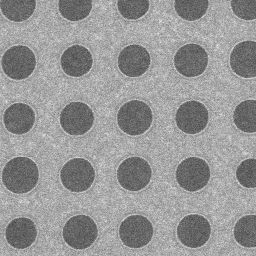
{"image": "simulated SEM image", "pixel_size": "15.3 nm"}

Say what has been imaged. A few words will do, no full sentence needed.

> a regular array of holes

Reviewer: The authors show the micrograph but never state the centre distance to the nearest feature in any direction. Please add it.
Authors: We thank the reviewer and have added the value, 864 nm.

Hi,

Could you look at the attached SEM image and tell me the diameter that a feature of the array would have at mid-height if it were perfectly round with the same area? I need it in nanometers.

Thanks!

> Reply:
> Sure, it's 527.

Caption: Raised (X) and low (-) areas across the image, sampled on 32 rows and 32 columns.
-----XX-----XXX----XXX----XXX---
----XXXX---XXXX---XXXX----XXX---
X--XXXXXX-XXXXXX-XXXXXX--XXXXXXX
XXXXXXXXXXXXXXXXXXXXXXXXXXXXXXXX
XXXXXXXXXXXXXXXXXXXXXXXXXXXXXXXX
XXXXXXXXXXXXXXXXXXXXXXXXXXXXXX--
X---XXXX---XXXX---XXXX----XXX---
----XXXX----XXX----XXX----XXX---
----XXXX---XXXX----XXX----XXX---
X---XXXXX-XXXXXX-XXXXXX-XXXXXX--
XXXXXXXXXXXXXXXXXXXXXXXXXXXXXXXX
XXXXXXXXXXXXXXXXXXXXXXXXXXXXXXXX
XXXXXXXXXXXXXXXXXXXXXXXXXXXXXXXX
X---XXXX---XXXX----XXX----XXX---
----XXXX----XXX----XXX----XXX---
----XXXX----XXX----XXX----XXX---
X--XXXXX---XXXX---XXXXX--XXXXXX-
XXXXXXXXXXXXXXXXXXXXXXXXXXXXXXXX
XXXXXXXXXXXXXXXXXXXXXXXXXXXXXXXX
XXXXXXXXXXXXXXXXXXXXXXXXXXXXXXXX
X---XXXX---XXXX----XXX----XXXX--
-----XXX----XXX----XXX----XXXX--
-----XXX----XXX----XXX----XXXX--
X---XXXX---XXXX---XXXXX--XXXXXXX
XXXXXXXXXXXXXXXXXXXXXXXXXXXXXXXX
XXXXXXXXXXXXXXXXXXXXXXXXXXXXXXXX
XXXXXXXXXXXXXXXXXXXXXXXXXXXXXXXX
X---XXXXX---XXX----XXXX---XXXX--
X----XXX----XXX----XXX----XXX---
X----XXX----XXX----XXX----XXX---
X---XXXX---XXXXX--XXXXX---XXXX--
XXXXXXXXXXXXXXXXXXXXXXXXXXXXXXXX